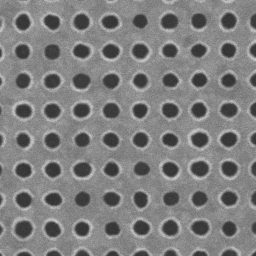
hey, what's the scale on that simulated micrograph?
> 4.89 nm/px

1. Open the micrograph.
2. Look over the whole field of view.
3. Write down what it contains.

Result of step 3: a regular array of holes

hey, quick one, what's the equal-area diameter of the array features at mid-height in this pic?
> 77.8 nm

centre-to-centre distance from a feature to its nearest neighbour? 28.9 px